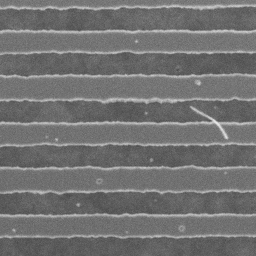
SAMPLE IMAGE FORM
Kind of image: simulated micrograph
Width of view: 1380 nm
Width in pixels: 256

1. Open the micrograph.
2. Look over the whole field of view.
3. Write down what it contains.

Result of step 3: lines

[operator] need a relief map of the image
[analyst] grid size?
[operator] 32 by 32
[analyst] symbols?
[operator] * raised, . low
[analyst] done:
********************************
................................
................................
................................
********************************
********************************
********************************
................................
................................
.*...********.*******..*********
********************************
********************************
***.***.*...**....*..***........
................................
................................
********************************
********************************
********************************
................................
................................
................................
********************************
********************************
********************************
................................
................................
................................
********************************
********************************
**************************..**.*
................................
................................